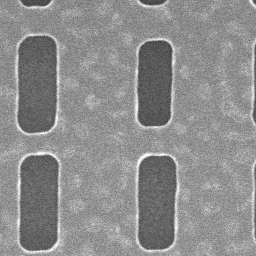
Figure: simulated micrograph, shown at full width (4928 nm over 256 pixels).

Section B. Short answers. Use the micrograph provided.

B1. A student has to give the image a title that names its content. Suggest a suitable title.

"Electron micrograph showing holes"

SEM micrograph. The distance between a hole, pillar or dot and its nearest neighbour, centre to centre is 2.27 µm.